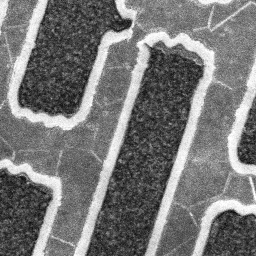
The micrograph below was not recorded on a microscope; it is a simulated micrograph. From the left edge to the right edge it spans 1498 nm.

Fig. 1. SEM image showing one or a few lines or trenches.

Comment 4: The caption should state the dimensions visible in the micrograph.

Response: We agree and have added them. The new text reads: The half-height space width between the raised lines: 0.393 micrometres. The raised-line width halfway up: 244 nanometres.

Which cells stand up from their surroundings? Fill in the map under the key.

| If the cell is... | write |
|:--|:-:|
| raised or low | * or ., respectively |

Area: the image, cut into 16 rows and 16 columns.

***.....********
**......********
**.....**..*****
*.....***....***
*.....***....***
*.....**.....***
*....***....***.
***..***....***.
*******.....***.
*******....****.
.******....****.
...***.....*****
....**....******
...***....***...
...**.....***...
..***.....**....